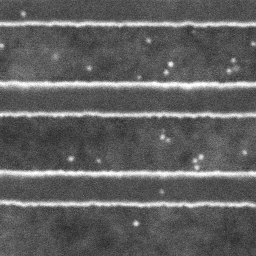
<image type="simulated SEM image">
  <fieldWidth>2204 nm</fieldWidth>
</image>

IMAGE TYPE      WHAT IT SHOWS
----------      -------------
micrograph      lines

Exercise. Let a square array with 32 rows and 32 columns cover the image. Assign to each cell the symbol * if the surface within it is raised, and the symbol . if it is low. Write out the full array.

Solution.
********************************
********************************
********************************
................................
................................
................................
................................
................................
................................
................................
***.******************..***..***
********************************
********************************
********************************
...........................**...
................................
................................
................................
................................
................................
................................
................................
********************************
********************************
********************************
..******************************
................................
................................
................................
................................
................................
................................